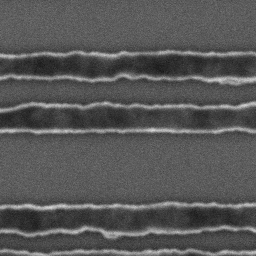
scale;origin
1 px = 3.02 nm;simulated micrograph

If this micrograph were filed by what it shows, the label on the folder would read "lines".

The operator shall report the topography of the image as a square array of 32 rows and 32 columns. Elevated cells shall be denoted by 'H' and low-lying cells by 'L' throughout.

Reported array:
LLLLLLLLLLLLLLLLLLLLLLLLLLLLLLLL
LLLLLLLLLLLLLLLLLLLLLLLLLLLLLLLL
LLLLLLLLLLLLLLLLLLLLLLLLLLLLLLLL
LLLLLLLLLLLLLLLLLLLLLLLLLLLLLLLL
LLLLLLLLLLLLLLLLLLLLLLLLLLLLLLLL
LLLLLLLLLLLLLLLLLLLLLLLLLLLLLLLL
LLLLLLLLLLLLLLLLLLLLLHLLLLLLLLLL
HHHHHHHHHHHHHHHHHHHHHHHHHHHHHHHH
HHHHHHHHHHHHHHHHHHHHHHHHHHHHHHHH
HHHHHHHHHHHHHHHHHHHHHHHHHHHHHHHH
LLLLLLLLLLLLLLLLLLLLLLLLLLLLLLLL
LLLLLLLLLLLLLLLLLLLLLLLLLLLLLLLL
LLLLLLLLLLLLLLLLLLLLLLLLLLLLLLLL
LLHHHHHHHHHHHHHHHHHHHHHHHHHHHHHH
HHHHHHHHHHHHHHHHHHHHHHHHHHHHHHHH
HHHHHHHHHHHHHHHHHHHHHHHHHHHHHHHH
LLLLHLLLLLLLLLLLLLLLLLLLLLHLLLLL
LLLLLLLLLLLLLLLLLLLLLLLLLLLLLLLL
LLLLLLLLLLLLLLLLLLLLLLLLLLLLLLLL
LLLLLLLLLLLLLLLLLLLLLLLLLLLLLLLL
LLLLLLLLLLLLLLLLLLLLLLLLLLLLLLLL
LLLLLLLLLLLLLLLLLLLLLLLLLLLLLLLL
LLLLLLLLLLLLLLLLLLLLLLLLLLLLLLLL
LLLLLLLLLLLLLLLLLLLLLLLLLLLLLLLL
LLLLLLLLLLLLLLLLLLLLLLLLLLLLLLLL
LLLLLLLLLLLLLLLLLLLHHHHHHHHLLLHL
HHHHHHHHHHHHHHHHHHHHHHHHHHHHHHHH
HHHHHHHHHHHHHHHHHHHHHHHHHHHHHHHH
HHHHHHHHHHHHHHHHHHHHHHHHHHHHHHHH
LLLHLLLLLLLLLLLLLLLLLLLLLLLLLLLL
LLLLLLLLLLLLLLLLLLLLLLLLLLLLLLLL
HHHLLLLLHHHHHHHHLLHHHHHHHHLLHHHH